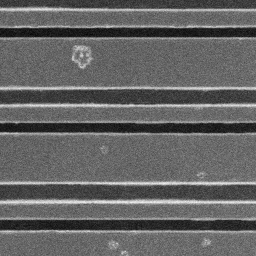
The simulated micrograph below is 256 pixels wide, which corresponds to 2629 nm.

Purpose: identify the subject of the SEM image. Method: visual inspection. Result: lines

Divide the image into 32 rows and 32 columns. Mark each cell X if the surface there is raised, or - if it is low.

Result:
--------------------------------
XXXXXXXXXXXXXXXXXXXXXXXXXXXXXXXX
XXXXXXXXXXXXXXXXXXXXXXXXXXXXXXXX
--------------------------------
--------------------------------
XXXXXXXXXXXXXXXXXXXXXXXXXXXXXXXX
XXXXXXXXXXXXXXXXXXXXXXXXXXXXXXXX
XXXXXXXXXXXXXXXXXXXXXXXXXXXXXXXX
XXXXXXXXXXXXXXXXXXXXXXXXXXXXXXXX
XXXXXXXXXXXXXXXXXXXXXXXXXXXXXXXX
XXXXXXXXXXXXXXXXXXXXXXXXXXXXXXXX
--------------------------------
--------------------------------
XXXXXXXXXXXXXXXXXXXXXXXXXXXXXXXX
XXXXXXXXXXXXXXXXXXXXXXXXXXXXXXXX
--------------------------------
--------------------------------
XXXXXXXXXXXXXXXXXXXXXXXXXXXXXXXX
XXXXXXXXXXXXXXXXXXXXXXXXXXXXXXXX
XXXXXXXXXXXXXXXXXXXXXXXXXXXXXXXX
XXXXXXXXXXXXXXXXXXXXXXXXXXXXXXXX
XXXXXXXXXXXXXXXXXXXXXXXXXXXXXXXX
XXXXXXXXXXXXXXXXXXXXXXXXXXXXXXXX
--------------------------------
--------------------------------
XXXXXXXXXXXXXXXXXXXXXXXXXXXXXXXX
XXXXXXXXXXXXXXXXXXXXXXXXXXXXXXXX
--------------------------------
--------------------------------
XXXXXXXXXXXXXXXXXXXXXXXXXXXXXXXX
XXXXXXXXXXXXXXXXXXXXXXXXXXXXXXXX
XXXXXXXXXXXXXXXXXXXXXXXXXXXXXXXX